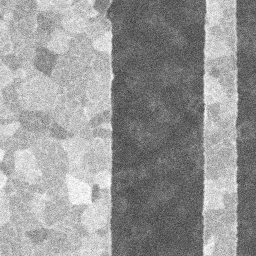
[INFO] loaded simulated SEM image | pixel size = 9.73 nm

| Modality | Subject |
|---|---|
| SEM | one or a few lines or trenches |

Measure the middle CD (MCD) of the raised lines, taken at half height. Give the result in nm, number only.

302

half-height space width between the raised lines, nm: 916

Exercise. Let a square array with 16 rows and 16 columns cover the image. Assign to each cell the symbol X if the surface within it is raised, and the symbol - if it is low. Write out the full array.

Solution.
XXXXXXX------XX-
XXXXXXX------XX-
XXXXXXX------XX-
XXXXXXX------XX-
XXXXXXX------XX-
XXXXXXX------XX-
XXXXXXX------XX-
XXXXXXX------XX-
XXXXXXX------XXX
XXXXXXX------XX-
XXXXXXX------XX-
XXXXXXX------XX-
XXXXXXX------XX-
XXXXXXX------XX-
XXXXXXX------XX-
XXXXXXX------XX-